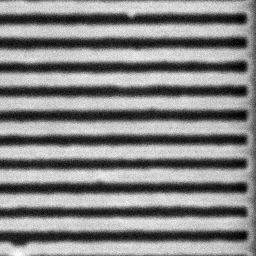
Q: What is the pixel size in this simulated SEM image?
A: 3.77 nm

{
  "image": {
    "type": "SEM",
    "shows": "parallel lines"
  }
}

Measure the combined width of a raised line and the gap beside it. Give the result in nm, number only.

90.8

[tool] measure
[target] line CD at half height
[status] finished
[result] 41.9 nm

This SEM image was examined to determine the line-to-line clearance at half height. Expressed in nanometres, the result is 48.